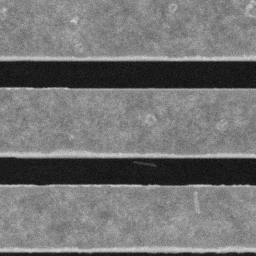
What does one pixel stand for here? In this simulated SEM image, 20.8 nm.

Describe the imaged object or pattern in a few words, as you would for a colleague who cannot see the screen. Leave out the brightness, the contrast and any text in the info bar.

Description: lines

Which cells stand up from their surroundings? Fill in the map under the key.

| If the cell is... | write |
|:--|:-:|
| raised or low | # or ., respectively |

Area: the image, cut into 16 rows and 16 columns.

################
################
################
################
................
................
################
################
################
################
................
................
################
################
################
################